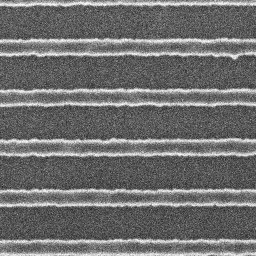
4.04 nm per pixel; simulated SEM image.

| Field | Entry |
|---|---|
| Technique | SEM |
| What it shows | parallel lines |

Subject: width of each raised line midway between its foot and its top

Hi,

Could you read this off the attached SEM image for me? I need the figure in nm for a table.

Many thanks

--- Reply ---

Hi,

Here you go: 59.1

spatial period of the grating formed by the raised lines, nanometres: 202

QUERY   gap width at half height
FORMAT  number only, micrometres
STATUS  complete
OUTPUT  0.143